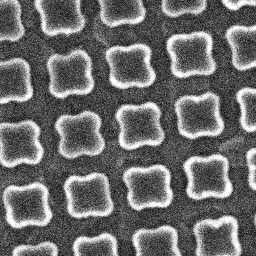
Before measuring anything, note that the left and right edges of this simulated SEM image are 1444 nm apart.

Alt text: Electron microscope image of a regular array of raised bodies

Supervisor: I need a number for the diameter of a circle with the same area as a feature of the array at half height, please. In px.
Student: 46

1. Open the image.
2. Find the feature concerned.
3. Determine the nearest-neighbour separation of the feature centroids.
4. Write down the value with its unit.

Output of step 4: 341 nanometres